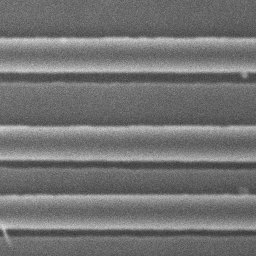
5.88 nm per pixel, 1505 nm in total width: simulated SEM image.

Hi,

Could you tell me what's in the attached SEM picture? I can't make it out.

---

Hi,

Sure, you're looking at lines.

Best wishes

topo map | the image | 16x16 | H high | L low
LLLLLLLLLLLLLLLL
LLLLLLLLLLLLLLLL
HHHHHHHHHHHHHHHH
HHHHHHHHHHHHHHHH
LLLLLLLLLLLLLLLL
LLLLLLLLLLLLLLLL
LLLLLLLLLLLLLLLL
LLLLLLLLLLLLLLLL
HHHHHHHHHHHHHHHH
HHHHHHHHHHHHHHHH
LLLLLLLLLLLLLLLL
LLLLLLLLLLLLLLLL
HHHHHHHHHHHHHHHH
HHHHHHHHHHHHHHHH
LLLLLLLLLLLLLLLL
LLLLLLLLLLLLLLLL